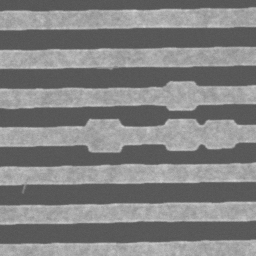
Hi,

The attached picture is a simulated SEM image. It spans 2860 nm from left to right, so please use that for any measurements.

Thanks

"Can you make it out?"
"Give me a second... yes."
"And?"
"wiring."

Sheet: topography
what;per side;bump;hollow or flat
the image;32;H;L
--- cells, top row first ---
LLLLLLLLLLLLLLLLLLLLLLLLLLLLLLLL
LLLLLLLLHHHHHHHHHHHHHHHHHHHHHHHH
HHHHHHHHHHHHHHHHHHHHHHHHHHHHHHHH
HHHHHHHHHLLLLLLLLLLLLLLLLLLLLLLL
LLLLLLLLLLLLLLLLLLLLLLLLLLLLLLLL
LLLLLLLLLLLLLLLLLLLLLLLLLLLLLLLL
LLLHHHHHHHHHHHHHHHHHHHHHHHHHHHHH
HHHHHHHHHHHHHHHHHHHHHHHHHHHHHHHH
LLLLLLLLLLLLLLLLLLLLLLLLLLLLLLLL
LLLLLLLLLLLLLLLLLLLLLLLLLLLLLLLL
LLLLLLLLLLLLLLLLLLLLLHHHLLLLLLLL
HHHHHHHHHHHHHHHHHHHHHHHHHHHHHHHH
HHHHHHHHHHHHHHHHHHHHHHHHHHHHHHHH
LLLLLLLLLLLLLLLLLLLLLHHHLLLLLLLL
LLLLLLLLLLLLLLLLLLLLLLLLLLLLLLLL
LLLLLLLLLLLHHHHLLLLLLHHHHLHHHLLL
HHHHHHHHHHHHHHHHHHHHHHHHHHHHHHHH
HHHHHHHHHHHHHHHHHHHHHHHHHHHHHHHH
LLLLLLLLLLLHHHHLLLLLLHHHLLLLLLLL
LLLLLLLLLLLLLLLLLLLLLLLLLLLLLLLL
LLLLLLLLLLLLLLLLLLLLLLLLLLLLLLLL
HHHHHHHHHHHHHHHHHHHHHHHHHHHHHHHH
HHHHHHHHHHHHHHHHHHHHHHHHHHHLLLLL
LLLLLLLLLLLLLLLLLLLLLLLLLLLLLLLL
LLLLLLLLLLLLLLLLLLLLLLLLLLLLLLLL
LLLLLLLLLLLLLLLLLLLLLLLLLLHHHHHH
HHHHHHHHHHHHHHHHHHHHHHHHHHHHHHHH
HHHHHHHHHHHHHHHHHHHHHHHHLLLHHHLL
LLLLLLLLLLLLLLLLLLLLLLLLLLLLLLLL
LLLLLLLLLLLLLLLLLLLLLLLLLLLLLLLL
LLLLLLLLLLLLLLLLLLLHHHHHHHHHHHHH
HHHHHHHHHHHHHHHHHHHHHHHHHHHHHHHH